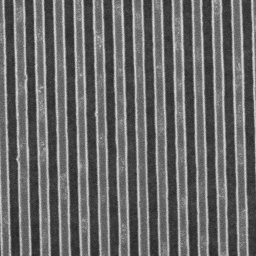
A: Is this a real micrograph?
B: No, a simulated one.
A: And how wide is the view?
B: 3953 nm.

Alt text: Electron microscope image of parallel lines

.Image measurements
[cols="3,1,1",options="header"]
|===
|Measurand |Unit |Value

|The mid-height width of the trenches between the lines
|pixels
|10.1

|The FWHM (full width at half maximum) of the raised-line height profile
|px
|9.25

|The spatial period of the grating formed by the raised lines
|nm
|305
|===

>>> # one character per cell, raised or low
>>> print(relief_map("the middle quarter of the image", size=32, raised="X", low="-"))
---XX---XX---XX---XX---XX---XX--
---XX---XX---XX---XX---XX---XX--
---XX---XX---XX---XX---XX---XX--
---XX---XX---XX---XX---XX---XX--
---XX---XX---XX---XX---XX---XX--
---XX---XX---XX---XX---XX---XX--
---XX---XX---XX---XX---XX---XX--
---XX---XX---XX---XX---XX---XX--
---XX---XX---XX---XX---XX---XX--
---XX---XX---XX---XX---XX---XX--
---XX---XX---XX---XX---XX---XX--
---XX---XX---XX---XX---XX---XX--
---XX---XX---XX---XX---XX---XX--
---XX---XX---XX---XX---XX---XX--
X--XX---XX---XX---XX---XX---XX--
X--XX---XX---XX---XX---XX---XX--
X---X---XX---XXX--XX---XX---XX--
X---X---XX---XX---XX---XX---XX--
X---X---XXX--XXX--XX---XX---XX--
X--XX---XXX--XXX--XX---XX---XX--
X--XXX--XXX--XXX--XX---XXX--XX--
X---XX---XX--XXX--XX---XX---XX--
X---XX---XX--XX---XXX--XX---XX--
X---XX---XX--XX---XXX--XX---XX--
X---XX---XX--XXX--XXX--XX---XX--
X---XX---XX--XXX--XXX--XX---XX--
X---XX---XX--XXX--XXX--XX---XXX-
X---XX---XX---XX---XX--XX---XXX-
X---XX---XX---XX---XX--XXX--XXX-
X---XX---XX---XX---XX--XXX---XX-
X---XX---XX---XX---XX--XXX---XX-
X---XX---XX---XX---XX---XX---XX-